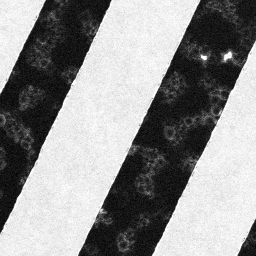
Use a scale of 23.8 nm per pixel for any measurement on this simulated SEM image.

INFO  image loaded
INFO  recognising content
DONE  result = one or a few lines or trenches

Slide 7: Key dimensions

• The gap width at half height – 1.84 microns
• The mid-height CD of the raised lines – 1500 nm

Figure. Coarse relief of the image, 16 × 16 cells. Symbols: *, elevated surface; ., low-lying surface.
...****.....****
..****......****
..****.....*****
.****......*****
.****.....*****.
****......*****.
****.....*****..
***......*****..
***.....*****...
***.....*****...
**.....*****....
**.....*****....
*......****.....
*.....*****.....
......****......
.....*****.....*